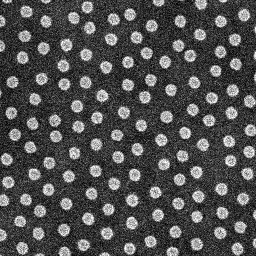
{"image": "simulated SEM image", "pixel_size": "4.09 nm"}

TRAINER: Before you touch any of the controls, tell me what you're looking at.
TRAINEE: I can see a regular array of raised bodies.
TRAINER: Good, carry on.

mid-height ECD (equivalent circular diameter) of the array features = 0.0442 microns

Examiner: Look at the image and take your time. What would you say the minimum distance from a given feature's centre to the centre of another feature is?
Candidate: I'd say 86.7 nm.